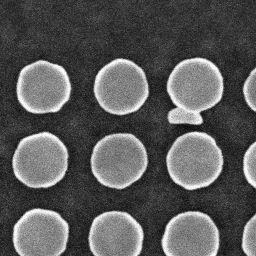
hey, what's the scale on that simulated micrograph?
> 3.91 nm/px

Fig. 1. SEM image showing raised bodies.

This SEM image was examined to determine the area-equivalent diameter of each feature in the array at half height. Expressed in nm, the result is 213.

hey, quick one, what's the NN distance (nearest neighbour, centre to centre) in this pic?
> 73 px